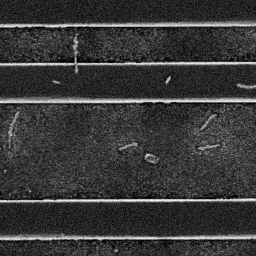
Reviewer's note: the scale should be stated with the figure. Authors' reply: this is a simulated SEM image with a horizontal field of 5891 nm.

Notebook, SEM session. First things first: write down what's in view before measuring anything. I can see lines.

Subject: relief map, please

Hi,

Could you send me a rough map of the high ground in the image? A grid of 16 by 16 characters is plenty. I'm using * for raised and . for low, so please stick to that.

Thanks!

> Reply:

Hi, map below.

****************
****************
................
................
****************
****************
................
................
................
................
................
................
................
****************
****************
................